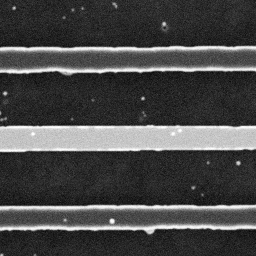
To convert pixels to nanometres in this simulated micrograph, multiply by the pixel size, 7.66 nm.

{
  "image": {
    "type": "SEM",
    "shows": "lines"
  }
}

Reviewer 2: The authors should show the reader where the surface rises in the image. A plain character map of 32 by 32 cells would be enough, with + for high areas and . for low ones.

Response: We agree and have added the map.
................................
................................
................................
................................
................................
................................
++++++++++++++++++++++++++++++++
++++++++++++++++++++++++++++++++
++++++++++++++++++++++++++++++++
................................
................................
................................
................................
................................
................................
................................
++++++++++++++++++++++++++++++++
++++++++++++++++++++++++++++++++
++++++++++++++++++++++++++++++++
................................
................................
................................
................................
................................
................................
................................
++++++++++++++++++++++++++++++++
++++++++++++++++++++++++++++++++
++++++++++++++++++++++..+.++++++
................................
................................
................................